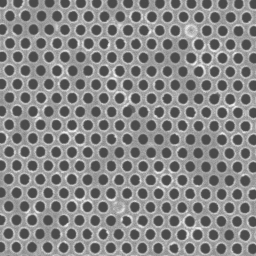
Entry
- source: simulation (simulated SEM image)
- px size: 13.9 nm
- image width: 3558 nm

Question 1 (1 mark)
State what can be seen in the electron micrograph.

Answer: a regular array of holes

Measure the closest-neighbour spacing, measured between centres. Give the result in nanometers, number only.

216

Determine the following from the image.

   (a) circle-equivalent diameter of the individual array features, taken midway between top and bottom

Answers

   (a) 143 nm